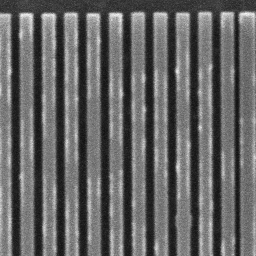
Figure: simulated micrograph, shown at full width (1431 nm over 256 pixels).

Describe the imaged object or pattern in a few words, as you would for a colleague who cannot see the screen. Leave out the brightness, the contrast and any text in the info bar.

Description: parallel lines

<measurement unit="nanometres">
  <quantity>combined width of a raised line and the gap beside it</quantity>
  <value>124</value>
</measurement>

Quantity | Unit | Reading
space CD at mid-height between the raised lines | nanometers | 56.6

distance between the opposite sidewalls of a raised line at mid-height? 67 nanometers